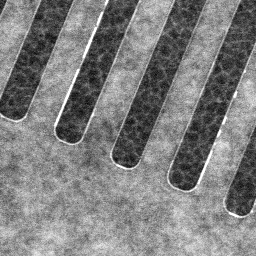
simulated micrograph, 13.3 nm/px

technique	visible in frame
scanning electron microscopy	one or a few lines or trenches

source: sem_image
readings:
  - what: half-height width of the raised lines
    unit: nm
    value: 411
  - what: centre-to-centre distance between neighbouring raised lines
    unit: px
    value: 61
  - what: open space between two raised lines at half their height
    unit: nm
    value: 411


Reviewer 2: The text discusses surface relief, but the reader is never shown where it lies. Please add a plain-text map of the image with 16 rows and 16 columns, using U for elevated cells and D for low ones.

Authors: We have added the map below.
DDUUDDDUUDDUUDDU
DDUUDDUUDDUUDDUU
DUUUDDUUDDUUDDUU
DUUDDUUDDUUDDDUU
DUUDDUUDDUUDDUUD
UUDDUUDDDUUDDUUD
UUDDUUDDUUDDUUDD
DDDDUUDDUUDDUUDD
DDDDUDDUUDDUUUDD
DDDDDDDUUDDUUDDU
DDDDDDDDDDDUUDDU
DDDDDDDDDDDUDDUU
DDDDDDDDDDDDDDUU
DDDDDDDDDDDDDDDD
DDDDDDDDDDDDDDDD
DDDDDDDDDDDDDDDD